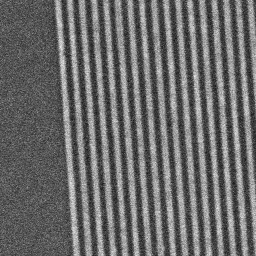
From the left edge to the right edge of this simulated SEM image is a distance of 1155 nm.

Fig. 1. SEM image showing parallel lines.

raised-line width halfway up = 3.37 pixels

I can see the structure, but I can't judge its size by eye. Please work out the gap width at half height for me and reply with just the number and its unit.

38.2 nm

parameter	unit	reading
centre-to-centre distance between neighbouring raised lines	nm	54.1